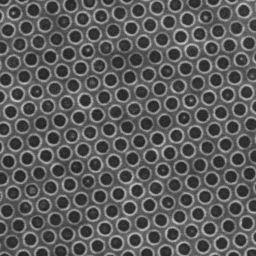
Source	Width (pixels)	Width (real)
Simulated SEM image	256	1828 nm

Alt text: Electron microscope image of a regular array of holes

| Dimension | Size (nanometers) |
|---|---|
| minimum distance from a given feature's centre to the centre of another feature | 131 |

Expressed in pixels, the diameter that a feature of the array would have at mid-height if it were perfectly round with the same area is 12.8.